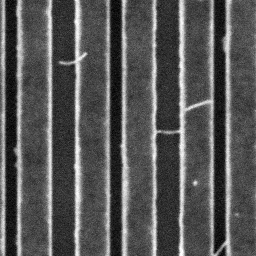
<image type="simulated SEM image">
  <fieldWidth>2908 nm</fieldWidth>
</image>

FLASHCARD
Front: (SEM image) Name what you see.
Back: lines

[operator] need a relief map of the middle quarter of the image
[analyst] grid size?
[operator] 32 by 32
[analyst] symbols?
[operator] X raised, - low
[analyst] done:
---XXXXXXXX----XXXXXXXX------XXX
---XXXXXXXX----XXXXXXXX------XXX
---XXXXXXXX----XXXXXXXX------XXX
---XXXXXXXX----XXXXXXXX------XXX
---XXXXXXXX----XXXXXXXX------XXX
---XXXXXXXX----XXXXXXXX------XXX
---XXXXXXXX----XXXXXXXX------XXX
---XXXXXXXX----XXXXXXXX------XXX
---XXXXXXXX----XXXXXXXX------XXX
---XXXXXXXX----XXXXXXXX------XXX
---XXXXXXXX----XXXXXXXX------XXX
---XXXXXXXX----XXXXXXXX------XXX
---XXXXXXXX----XXXXXXXX------XXX
---XXXXXXXX----XXXXXXXX------XXX
---XXXXXXXX----XXXXXXXX------XXX
---XXXXXXXX----XXXXXXXX------XXX
---XXXXXXXX----XXXXXXXX------XXX
---XXXXXXXX----XXXXXXXX------XXX
---XXXXXXXX----XXXXXXXX------XXX
---XXXXXXXX----XXXXXXXX------XXX
---XXXXXXXX----XXXXXXXX------XXX
---XXXXXXXX----XXXXXXXX------XXX
---XXXXXXXX----XXXXXXXX------XXX
---XXXXXXXX----XXXXXXXX------XXX
---XXXXXXXX----XXXXXXXX------XXX
---XXXXXXXX----XXXXXXXX------XXX
---XXXXXXXX----XXXXXXXX------XXX
---XXXXXXXX----XXXXXXXX------XXX
---XXXXXXXX----XXXXXXXX------XXX
---XXXXXXXX----XXXXXXXX------XXX
---XXXXXXXX----XXXXXXXX------XXX
---XXXXXXXX----XXXXXXXX------XXX